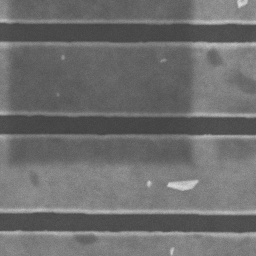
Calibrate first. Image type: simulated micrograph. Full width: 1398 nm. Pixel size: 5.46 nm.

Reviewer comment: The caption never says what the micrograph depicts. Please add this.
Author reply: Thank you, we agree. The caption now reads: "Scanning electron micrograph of lines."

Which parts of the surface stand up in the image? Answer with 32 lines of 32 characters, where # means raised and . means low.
################################
################################
################################
................................
................................
################################
################################
################################
################################
################################
################################
################################
################################
################################
...................##..#..#.####
................................
................................
################################
################################
################################
################################
################################
################################
################################
################################
################################
..........######################
................................
................................
################################
################################
################################